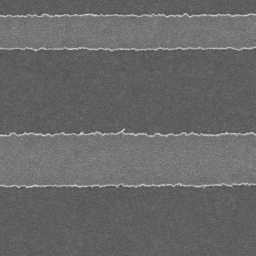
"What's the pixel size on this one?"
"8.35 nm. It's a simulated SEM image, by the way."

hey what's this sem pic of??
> one or a few lines or trenches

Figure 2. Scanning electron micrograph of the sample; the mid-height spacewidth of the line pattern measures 708 nm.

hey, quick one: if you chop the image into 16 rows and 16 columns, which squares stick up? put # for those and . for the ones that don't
................
################
################
................
................
................
................
................
################
################
################
################
................
................
................
................